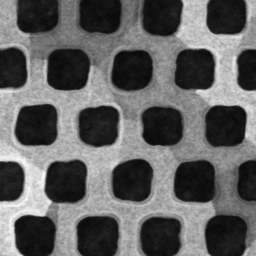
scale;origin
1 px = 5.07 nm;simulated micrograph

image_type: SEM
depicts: a regular array of holes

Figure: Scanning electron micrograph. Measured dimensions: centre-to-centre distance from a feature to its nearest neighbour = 318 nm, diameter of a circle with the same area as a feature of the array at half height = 227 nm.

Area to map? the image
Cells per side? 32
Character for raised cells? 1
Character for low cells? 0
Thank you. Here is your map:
11000001110000011100000111000001
11000001110000011100000111000001
11000001110000011100000111000001
11000001110000011100001111000001
11111111111111111110001111110111
11111111111111111111111111111111
00011110001111100011111000111100
00011100000111000001110000011100
00011100000111000001110000011100
00011100000111000001110000011100
00011100000111000001110000011100
11111111111111111111111111111111
11111111111111111111111111111111
11100001111000111110001111000011
11000001110000011100000111000001
11000001110000011100000111000001
11000001110000011100000111000001
11000001110000011100000111000011
11111111111111111111111111111111
11111111111111111111111111111111
00111100000111100001111000111100
00011100000111000001110000011100
00011100000111000001110000011100
00011000000111000001110000011100
00011100000111000001110000011100
11111111111111111111111111111111
11111111111111111111111111111111
11000001110000011100001111000011
11000001110000011000000111000001
11000001110000011000000111000001
11000001110000011000000111000001
11000001110000011100001111000001